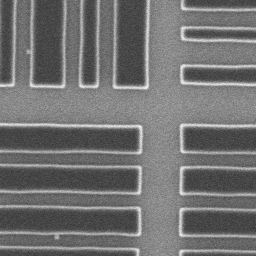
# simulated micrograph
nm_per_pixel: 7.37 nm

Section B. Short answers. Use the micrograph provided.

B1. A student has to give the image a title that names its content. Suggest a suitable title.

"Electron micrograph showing groups of lines, slits or small figures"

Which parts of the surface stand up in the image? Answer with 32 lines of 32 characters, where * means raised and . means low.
**..****..**..*****....*********
**..****..**..*****.............
**..****..**..*****.............
**..****..**..*****....*****....
**..****..**..****.....*********
**..****..**..****..............
**..****..**..****..............
**..****..**..****..............
**..****..**..****.....*********
**..****..**..****.....*********
*...****..**..****...........***
................................
................................
................................
................................
................................
******************.....*********
******************.....*********
******************.....*********
................................
................................
******************.....*********
******************.....*********
*****************......*********
................................
................................
*****************......*********
*****************......*********
*****************......*********
.......................*********
................................
*****************......*********